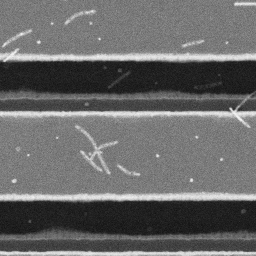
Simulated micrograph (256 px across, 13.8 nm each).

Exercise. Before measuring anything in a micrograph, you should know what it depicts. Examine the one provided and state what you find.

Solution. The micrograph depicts lines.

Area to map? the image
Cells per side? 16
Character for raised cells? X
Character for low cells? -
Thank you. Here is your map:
XXXXXXXXXXXXXXXX
XXXXXXXXXXXXXXXX
XXXXXXXXXXXXXXXX
XXXXXXXXXXXXXXXX
----------------
----------------
----------------
XXXXXXXXXXXXXXXX
XXXXXXXXXXXXXXXX
XXXXXXXXXXXXXXXX
XXXXXXXXXXXXXXXX
XXXXXXXXXXXXXXXX
XXXXXX-XXXX-XX-X
----------------
----------------
----------------